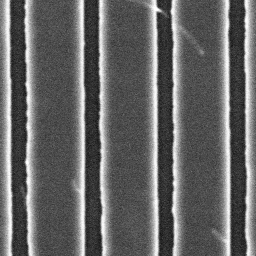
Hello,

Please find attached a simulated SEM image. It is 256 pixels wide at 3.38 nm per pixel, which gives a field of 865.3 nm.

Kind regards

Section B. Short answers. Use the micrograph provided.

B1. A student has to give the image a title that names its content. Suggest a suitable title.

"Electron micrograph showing lines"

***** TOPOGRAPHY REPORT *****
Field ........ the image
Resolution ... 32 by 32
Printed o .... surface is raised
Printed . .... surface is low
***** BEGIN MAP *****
o..ooooooo..ooooooo...oooooo...o
o..ooooooo..oooooooo.ooooooo...o
o..ooooooo..ooooooo...oooooo...o
o..ooooooo..ooooooo...oooooo...o
o..ooooooo..ooooooo...oooooo...o
o..ooooooo..ooooooo...oooooo...o
o..ooooooo..ooooooo...oooooo...o
o..ooooooo..ooooooo...oooooo...o
o..ooooooo..ooooooo...oooooo...o
o..ooooooo..ooooooo...ooooooo..o
o..ooooooo...oooooo...ooooooo..o
o..ooooooo..oooooooo..ooooooo..o
o..ooooooo..ooooooo...ooooooo..o
o..ooooooo...oooooo...ooooooo..o
o..ooooooo..ooooooo...ooooooo..o
o..ooooooo..oooooooo..ooooooo..o
o...oooooo..ooooooo...ooooooo..o
o...oooooo...ooooooo..ooooooo..o
o..ooooooo...ooooooo..ooooooo..o
o..ooooooo...ooooooo..ooooooo..o
o..ooooooo...ooooooo..ooooooo..o
o..ooooooo...ooooooo..ooooooo..o
o..ooooooo...ooooooo..ooooooo..o
o...oooooo...ooooooo..ooooooo..o
o..ooooooo...ooooooo..ooooooo..o
o..ooooooo...ooooooo..ooooooo..o
o..ooooooo...ooooooo..ooooooo..o
o...oooooo...ooooooo..ooooooo..o
o...oooooo...ooooooo..ooooooo..o
o...oooooo...ooooooo..ooooooo..o
o...oooooo...ooooooo..ooooooo..o
o...oooooo...ooooooo..ooooooo..o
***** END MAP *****